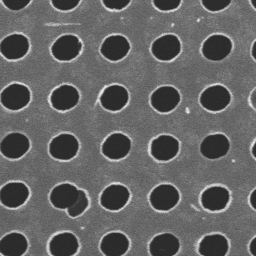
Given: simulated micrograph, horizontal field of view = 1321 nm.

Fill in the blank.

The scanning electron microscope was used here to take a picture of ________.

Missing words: a regular array of holes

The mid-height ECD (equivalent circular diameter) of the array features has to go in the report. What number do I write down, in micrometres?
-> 0.139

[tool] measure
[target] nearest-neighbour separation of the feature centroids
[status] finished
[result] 0.252 um